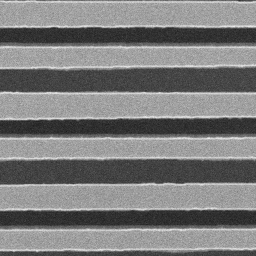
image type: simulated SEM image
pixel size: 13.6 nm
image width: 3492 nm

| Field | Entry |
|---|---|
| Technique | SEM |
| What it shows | lines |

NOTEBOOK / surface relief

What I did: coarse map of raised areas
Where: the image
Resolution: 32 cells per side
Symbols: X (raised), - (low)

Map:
XXXXXXXXXXXXXXXXXXXXXXXXXXXXXXXX
XXXXXXXXXXXXXXXXXXXXXXXXXXXXXXXX
XXXXXXXXXXXXXXXXXXXXXXXXXXXXXXXX
--------------------------------
--------------------------------
--------------------------------
XXXXXXXXXXXXXXXXXXXXXXXXXXXXXXXX
XXXXXXXXXXXXXXXXXXXXXXXXXXXXXXXX
XXXXX-XXXX----------------------
--------------------------------
--------------------------------
--------------------------------
XXXXXXXXXXXXXXXXXXXXXXXXXXXXXXXX
XXXXXXXXXXXXXXXXXXXXXXXXXXXXXXXX
XXXXXXXXXXXXXXXXXXXXXXXXXXXXXXXX
--------------------------------
--------------------------------
XXXXXXXXXXXXXXXXXXXXXXXXXXXXXXXX
XXXXXXXXXXXXXXXXXXXXXXXXXXXXXXXX
XXXXXXXXXXXXXXXXXXXXXXXXXXXXXXXX
--------------------------------
--------------------------------
--------------------------------
XXXXXXXXXXXXXXXXXXXXXXXXXXXXXXXX
XXXXXXXXXXXXXXXXXXXXXXXXXXXXXXXX
XXXXXXXXXXXXXXXXXXXXXXXXXXXXXXXX
--------------------------------
--------------------------------
--------------------------------
XXXXXXXXXXXXXXXXXXXXXXXXXXXXXXXX
XXXXXXXXXXXXXXXXXXXXXXXXXXXXXXXX
--------------------------------